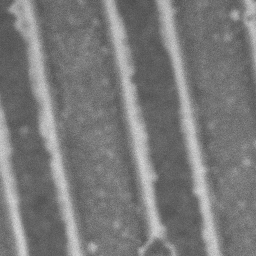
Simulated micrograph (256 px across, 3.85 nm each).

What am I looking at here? one or a few lines or trenches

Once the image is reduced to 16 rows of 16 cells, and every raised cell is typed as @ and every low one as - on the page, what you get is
@@-----@@@------
@@-----@@@@-----
@@-----@@@@-----
@@------@@@-----
@@------@@@-----
@@@-----@@@-----
@@@-----@@@@----
@@@-----@@@@----
@@@------@@@----
@@@------@@@----
@@@@-----@@@----
-@@@-----@@@@---
-@@@-----@@@@---
-@@@------@@@---
-@@@@-----@@@---
-@@@@----@@@@---